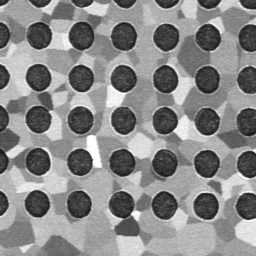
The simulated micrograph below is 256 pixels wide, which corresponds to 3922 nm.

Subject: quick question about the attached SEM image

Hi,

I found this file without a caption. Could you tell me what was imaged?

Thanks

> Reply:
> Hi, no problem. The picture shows a regular array of holes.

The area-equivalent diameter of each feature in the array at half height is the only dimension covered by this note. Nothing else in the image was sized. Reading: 419 nanometers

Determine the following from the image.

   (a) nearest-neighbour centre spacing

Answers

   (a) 640 nm